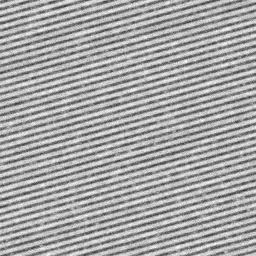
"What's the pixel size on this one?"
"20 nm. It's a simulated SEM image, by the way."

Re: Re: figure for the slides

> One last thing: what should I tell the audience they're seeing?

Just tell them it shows parallel lines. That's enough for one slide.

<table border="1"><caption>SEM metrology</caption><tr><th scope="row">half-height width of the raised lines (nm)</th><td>55.6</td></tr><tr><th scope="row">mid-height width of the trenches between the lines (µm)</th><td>0.0773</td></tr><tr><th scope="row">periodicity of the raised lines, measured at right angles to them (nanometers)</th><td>137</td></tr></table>